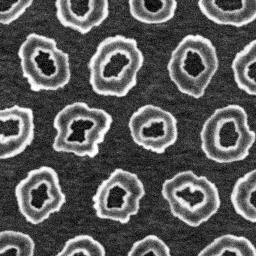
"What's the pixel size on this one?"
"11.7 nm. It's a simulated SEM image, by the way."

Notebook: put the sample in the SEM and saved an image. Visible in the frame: a regular array of ring-shaped raised bodies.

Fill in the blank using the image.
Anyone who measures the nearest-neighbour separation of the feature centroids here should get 836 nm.